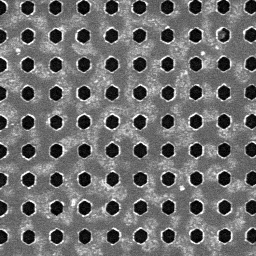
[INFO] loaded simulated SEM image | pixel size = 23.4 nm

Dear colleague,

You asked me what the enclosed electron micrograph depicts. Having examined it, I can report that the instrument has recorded a regular array of holes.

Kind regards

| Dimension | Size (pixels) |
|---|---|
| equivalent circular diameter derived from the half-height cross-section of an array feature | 14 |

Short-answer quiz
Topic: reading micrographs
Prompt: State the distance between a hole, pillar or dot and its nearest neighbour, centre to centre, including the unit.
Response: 655 nanometers